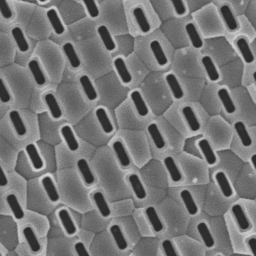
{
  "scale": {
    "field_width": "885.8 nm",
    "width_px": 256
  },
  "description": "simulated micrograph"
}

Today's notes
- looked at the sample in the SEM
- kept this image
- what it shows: a regular array of holes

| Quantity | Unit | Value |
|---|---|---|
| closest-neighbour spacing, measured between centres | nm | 127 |